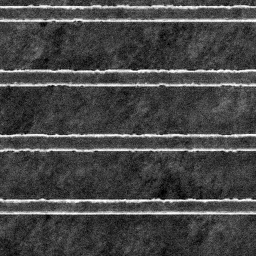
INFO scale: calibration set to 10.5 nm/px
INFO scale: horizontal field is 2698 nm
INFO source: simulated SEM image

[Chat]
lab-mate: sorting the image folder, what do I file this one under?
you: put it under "lines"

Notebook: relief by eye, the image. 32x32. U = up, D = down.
DDDDDDDDDDDDDDDDDDDDDDDDDDDDDDDD
UUUUUUUUUUUUUUUUUUUUUUUUUUUUUUUU
UUUUUUDUUDDUUUUUUUUUUUUUUUUUUUUU
DDDDDDDDDDDDDDDDDDDDDDDDDDDDDDDD
DDDDDDDDDDDDDDDDDDDDDDDDDDDDDDDD
DDDDDDDDDDDDDDDDDDDDDDDDDDDDDDDD
DDDDDDDDDDDDDDDDDDDDDDDDDDDDDDDD
DDDDDDDDDDDDDDDDDDDDDDDDDDDDDDDD
DDDDDDDDDDDDDDDDDDDDDDDDDDDDDDDD
UUUUUUUUUUUUUUUUUUUUUUUUUUUUUUUU
UUUUUUUUUUUUUUUUUUUUUUUUUUUUUUUU
DDDDDDDDDDDDDDDDDDDDDDDDDDDDDDDD
DDDDDDDDDDDDDDDDDDDDDDDDDDDDDDDD
DDDDDDDDDDDDDDDDDDDDDDDDDDDDDDDD
DDDDDDDDDDDDDDDDDDDDDDDDDDDDDDDD
DDDDDDDDDDDDDDDDDDDDDDDDDDDDDDDD
DDDDDDDDDDDDDDDDDDDDDDDDDDDDDDDD
UUUUUUUUUUUUUUUUUUUUUUUUUUUUUUUU
UUUUUUUUUUUUUUUUUUUUUUUUUUUUUUUU
DDDDDDDDDDDDDDDDDDDDDDDDDDDDDDDD
DDDDDDDDDDDDDDDDDDDDDDDDDDDDDDDD
DDDDDDDDDDDDDDDDDDDDDDDDDDDDDDDD
DDDDDDDDDDDDDDDDDDDDDDDDDDDDDDDD
DDDDDDDDDDDDDDDDDDDDDDDDDDDDDDDD
DDDDDDDDDDDDDDDDDDDDDDDDDDDDDDDD
UUUUUUUUUUUUUUUUUUUUUUUUUUUUUUUU
UUUUUUUUUUUUUUUUUUUUUUUUUUUUUUUU
DDDDDDDDDDDDDDDDDDDDDDDDDDDDDDDD
DDDDDDDDDDDDDDDDDDDDDDDDDDDDDDDD
DDDDDDDDDDDDDDDDDDDDDDDDDDDDDDDD
DDDDDDDDDDDDDDDDDDDDDDDDDDDDDDDD
DDDDDDDDDDDDDDDDDDDDDDDDDDDDDDDD